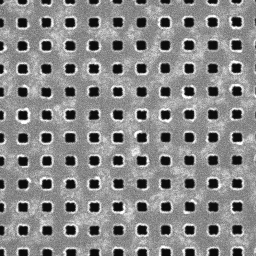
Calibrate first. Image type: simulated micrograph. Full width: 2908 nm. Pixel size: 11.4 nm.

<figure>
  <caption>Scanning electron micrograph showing a regular array of holes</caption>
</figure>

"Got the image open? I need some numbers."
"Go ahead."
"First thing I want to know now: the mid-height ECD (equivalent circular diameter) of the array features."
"123 nanometers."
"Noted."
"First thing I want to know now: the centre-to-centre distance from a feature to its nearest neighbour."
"0.261 microns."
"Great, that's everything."